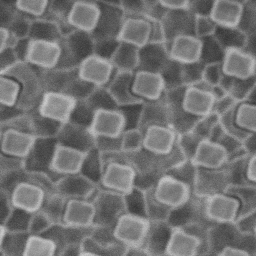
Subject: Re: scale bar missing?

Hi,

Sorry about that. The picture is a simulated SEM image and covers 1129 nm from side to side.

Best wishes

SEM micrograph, a regular array of raised bodies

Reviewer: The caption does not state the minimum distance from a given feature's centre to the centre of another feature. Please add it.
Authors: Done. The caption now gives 235 nanometres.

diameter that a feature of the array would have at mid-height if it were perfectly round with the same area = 124 nanometres